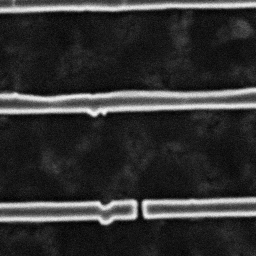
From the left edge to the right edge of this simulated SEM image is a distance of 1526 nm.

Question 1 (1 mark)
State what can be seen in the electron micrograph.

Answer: one or a few lines or trenches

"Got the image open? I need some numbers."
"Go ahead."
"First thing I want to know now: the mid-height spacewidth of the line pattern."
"532 nanometers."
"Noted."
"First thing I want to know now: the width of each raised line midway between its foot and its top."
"87.1 nm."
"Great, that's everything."